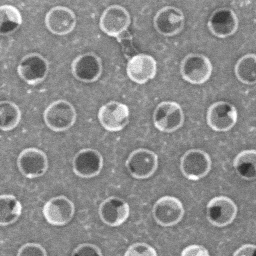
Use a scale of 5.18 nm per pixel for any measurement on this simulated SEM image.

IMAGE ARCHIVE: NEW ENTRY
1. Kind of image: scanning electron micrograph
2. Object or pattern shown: a regular array of raised bodies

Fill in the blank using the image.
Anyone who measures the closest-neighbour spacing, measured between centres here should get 279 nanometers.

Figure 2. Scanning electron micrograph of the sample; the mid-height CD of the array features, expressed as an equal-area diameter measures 27.9 pixels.